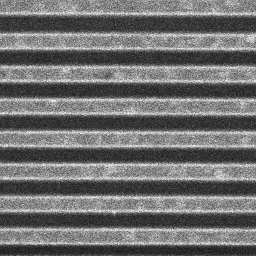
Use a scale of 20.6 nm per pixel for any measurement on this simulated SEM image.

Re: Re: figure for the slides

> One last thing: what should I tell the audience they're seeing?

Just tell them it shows parallel lines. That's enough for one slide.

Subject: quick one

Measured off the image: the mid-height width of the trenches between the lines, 294 nanometres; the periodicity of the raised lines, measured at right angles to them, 670 nm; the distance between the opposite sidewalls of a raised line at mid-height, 0.374 um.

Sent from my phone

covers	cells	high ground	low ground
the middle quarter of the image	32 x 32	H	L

HHHHHHHHHHHHHHHHHHHHHHHHHHHHHHHH
HHHHHHHHHHHHHHHHHHHHHHHHHHHHHHHH
HHHHHHHHHHHHHHHHHHHHHHHHHHHHHHHH
HHHHHHHHHHHHHHHHHHHHHHHHHHHHHHHH
HHHHHHHHHHHHHHHHHHHHHHHHHHHHHHHH
LLLLLLLLLLLLLLLLLLLLLLLLLLLLLLLL
LLLLLLLLLLLLLLLLLLLLLLLLLLLLLLLL
LLLLLLLLLLLLLLLLLLLLLLLLLLLLLLLL
HHHHHHHHHHHHHHHHHHHHHHHHHHLLLLLL
HHHHHHHHHHHHHHHHHHHHHHHHHHHHHHHH
HHHHHHHHHHHHHHHHHHHHHHHHHHHHHHHH
HHHHHHHHHHHHHHHHHHHHHHHHHHHHHHHH
HHHHHHHHHHHHHHHHHHHHHHHHHHHHHHHH
LLLLLLLLLLLLLLLLLLLLLLLLLLLLLLLL
LLLLLLLLLLLLLLLLLLLLLLLLLLLLLLLL
LLLLLLLLLLLLLLLLLLLLLLLLLLLLLLLL
LLLLLLLLLLLLLLLLLLLLLLLLLLLLLLLL
HHHHHHHHHHHHHHHHHHHHHHHHHHHHHHHH
HHHHHHHHHHHHHHHHHHHHHHHHHHHHHHHH
HHHHHHHHHHHHHHHHHHHHHHHHHHHHHHHH
HHHHHHHHHHHHHHHHHHHHHHHHHHHHHHHH
LLLLLLLLLLLLLLLLLLLLLLLLLLLLLLLL
LLLLLLLLLLLLLLLLLLLLLLLLLLLLLLLL
LLLLLLLLLLLLLLLLLLLLLLLLLLLLLLLL
LLLLLLLLLLLLLLLLLLLLLLLLLLLLLLLL
HHHHHHHHHHHHHHHHHHHHHHHHHHHHHHHH
HHHHHHHHHHHHHHHHHHHHHHHHHHHHHHHH
HHHHHHHHHHHHHHHHHHHHHHHHHHHHHHHH
HHHHHHHHHHHHHHHHHHHHHHHHHHHHHHHH
LLLLLLLLLLLLLLLLLLLLLLLLLLLLLLLL
LLLLLLLLLLLLLLLLLLLLLLLLLLLLLLLL
LLLLLLLLLLLLLLLLLLLLLLLLLLLLLLLL